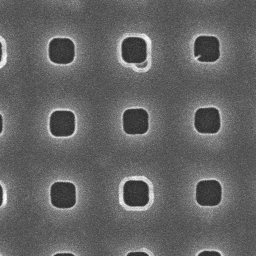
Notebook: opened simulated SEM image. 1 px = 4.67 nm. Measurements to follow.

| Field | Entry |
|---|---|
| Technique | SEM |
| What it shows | a regular array of holes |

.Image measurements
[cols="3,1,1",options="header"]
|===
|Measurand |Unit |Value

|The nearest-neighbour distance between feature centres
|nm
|335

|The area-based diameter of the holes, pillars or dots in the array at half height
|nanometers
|132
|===